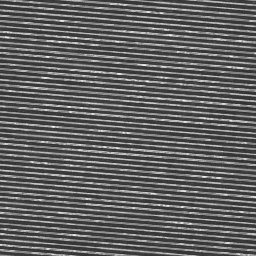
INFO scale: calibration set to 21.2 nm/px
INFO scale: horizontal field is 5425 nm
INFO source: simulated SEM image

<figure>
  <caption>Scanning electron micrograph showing parallel lines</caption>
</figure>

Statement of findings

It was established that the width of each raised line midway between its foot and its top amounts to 1.87 px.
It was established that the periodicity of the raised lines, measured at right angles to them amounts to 0.113 microns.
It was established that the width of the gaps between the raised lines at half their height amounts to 81.9 nanometres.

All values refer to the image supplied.